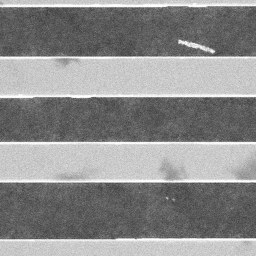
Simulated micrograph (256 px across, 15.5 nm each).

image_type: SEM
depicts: lines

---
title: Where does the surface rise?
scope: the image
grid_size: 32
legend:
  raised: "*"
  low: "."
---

********************************
................................
................................
................................
................................
................................
................................
********************************
********************************
********************************
********************************
********************************
................................
................................
................................
................................
................................
................................
********************************
********************************
********************************
********************************
********************************
................................
................................
................................
................................
................................
................................
................................
********************************
********************************